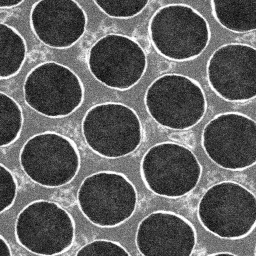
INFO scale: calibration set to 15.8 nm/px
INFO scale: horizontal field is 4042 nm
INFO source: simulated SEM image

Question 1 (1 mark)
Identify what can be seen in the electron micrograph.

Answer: a regular array of holes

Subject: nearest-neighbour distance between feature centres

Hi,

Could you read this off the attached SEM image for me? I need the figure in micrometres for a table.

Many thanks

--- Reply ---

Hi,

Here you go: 1.08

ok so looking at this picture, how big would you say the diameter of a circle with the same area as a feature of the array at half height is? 882 nanometres